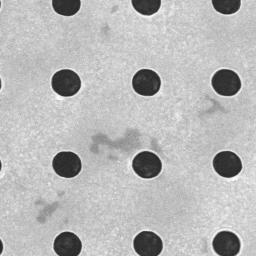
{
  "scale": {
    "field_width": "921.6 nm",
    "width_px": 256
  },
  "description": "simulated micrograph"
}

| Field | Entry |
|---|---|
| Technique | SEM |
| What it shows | holes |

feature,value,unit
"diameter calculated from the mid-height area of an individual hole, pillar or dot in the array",0.104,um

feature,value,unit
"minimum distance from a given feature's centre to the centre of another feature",289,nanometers